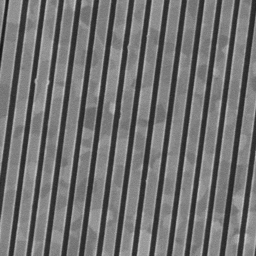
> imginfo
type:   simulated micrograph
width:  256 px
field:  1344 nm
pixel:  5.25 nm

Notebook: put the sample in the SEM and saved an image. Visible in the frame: parallel lines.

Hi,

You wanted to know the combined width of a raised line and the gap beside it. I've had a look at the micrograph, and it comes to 91.8 nm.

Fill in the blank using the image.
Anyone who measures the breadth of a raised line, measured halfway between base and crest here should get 58.6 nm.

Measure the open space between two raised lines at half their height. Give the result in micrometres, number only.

0.0338